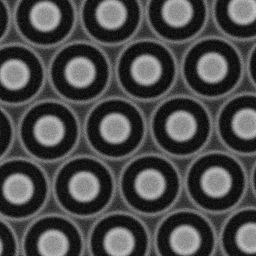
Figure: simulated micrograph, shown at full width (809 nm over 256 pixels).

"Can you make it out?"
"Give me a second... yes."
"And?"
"an array of small figures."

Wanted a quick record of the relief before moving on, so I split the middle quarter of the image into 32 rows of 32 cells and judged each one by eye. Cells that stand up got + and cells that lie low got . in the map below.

.++++++....++....+++++++....++..
.+++++++...++....+++++++....++..
.+++++++...++....+++++++....++..
.++++++....+++....++++++...+++..
.++++++....+++.....++++....++++.
...++.....++++.............++++.
..........+++++...........++++++
.........+++++++.........+++++++
........+++++++++++...++++++...+
++++++++++......+++++++++.......
++++++++..........++++++........
.++++++............++++.........
..++++.............++++.....+++.
...+++....+++++....+++....++++++
...+++....++++++....++....++++++
....+....+++++++....++....++++++
....+....+++++++....++....++++++
...+++....++++++....++....++++++
...+++....+++++.....+++.....+++.
...+++.............++++.........
..+++++............+++++........
..++++++..........+++++++.......
.++++++++.......+++++++++++....+
+++...+++++++.+++++......+++++++
+........++++++++.........++++++
..........++++++...........+++++
...........++++.............+++.
....++......+++....+++++....+++.
..++++++....++....+++++++....++.
..++++++....++....+++++++....++.
..+++++++...++....+++++++....++.
..+++++++...++....+++++++....++.